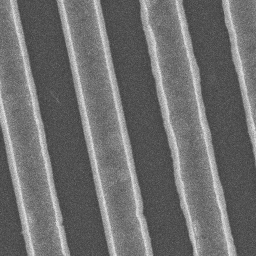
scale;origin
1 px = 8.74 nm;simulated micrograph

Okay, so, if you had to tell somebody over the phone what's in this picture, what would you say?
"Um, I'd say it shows one or a few lines or trenches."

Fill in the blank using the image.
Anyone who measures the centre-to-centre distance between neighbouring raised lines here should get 704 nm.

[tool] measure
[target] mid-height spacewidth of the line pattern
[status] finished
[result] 389 nanometres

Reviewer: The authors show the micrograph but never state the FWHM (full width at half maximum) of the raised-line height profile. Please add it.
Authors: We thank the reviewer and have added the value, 36.1 pixels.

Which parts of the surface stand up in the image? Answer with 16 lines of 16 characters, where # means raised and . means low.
#...##...##...##
#...##...##...##
#...###..###...#
##..###...##...#
##...##...##...#
##...##...##...#
##...##...###..#
##...###..###...
###..###...##...
.##...##...##...
.##...##...##...
.##...##...###..
.##...###..###..
.###...##...##..
..##...##...##..
..##...##...##..